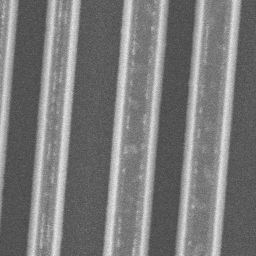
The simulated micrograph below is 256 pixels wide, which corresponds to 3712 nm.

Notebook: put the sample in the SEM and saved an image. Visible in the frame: one or a few lines or trenches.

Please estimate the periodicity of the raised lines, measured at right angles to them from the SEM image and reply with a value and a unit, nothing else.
1110 nanometres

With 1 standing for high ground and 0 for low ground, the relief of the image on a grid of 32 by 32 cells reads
11000011110000001111100001111100
11000011110000001111100001111100
11000011100000001111000001111000
11000011100000001111000001111000
11000011100000001111000001111000
10000011100000011111000011111000
10000011100000011111000011111000
10000011100000011111000011111000
10000011100000011111000011111000
10000011100000011111000011111000
10000111100000011111000011111000
10000111100000011111000011111000
10000111100000011111000011111000
10000111100000011111000011111000
10000111100000011110000011110000
10000111000000011110000011110000
10000111000000011110000011110000
00000111000000111110000111110000
00000111000000111110000111110000
00000111000000111110000111110000
00000111000000111110000111110000
00000111000000111110000111110000
00000111000000111110000111110000
00001111000000111110000111110000
00001111000000111110000111110000
00001111000000111110000111110000
00001111000000111100000111100000
00001110000000111100000111100000
00001110000000111100000111100000
00001110000000111100000111100000
00001110000001111100001111100000
00001110000001111100001111100000